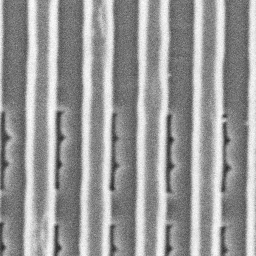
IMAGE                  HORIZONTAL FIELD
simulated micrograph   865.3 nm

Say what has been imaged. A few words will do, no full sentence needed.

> wiring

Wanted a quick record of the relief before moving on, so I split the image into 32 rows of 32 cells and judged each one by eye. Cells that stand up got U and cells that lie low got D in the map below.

DDDDUUUDDDDUUUDDDDUUUDDDDUUUDDDD
DDDDUUUDDDDUUUDDDDUUUDDDDUUUDDDD
DDDDUUUDDDDUUUDDDDUUUDDDDUUUDDDD
DDDDUUUDDDDUUUDDDDUUUDDDDUUUDDDD
DDDDUUUDDDDUUUDDDDUUUDDDDUUUDDDD
DDDDUUUDDDDUUUDDDDUUUDDDDUUUDDDD
DDDDUUUDDDDUUUDDDDUUUDDDDUUUDDDD
DDDDUUUDDDDUUUDDDDUUUDDDDUUUDDDD
DDDDUUUDDDDUUUDDDDUUUDDDDUUDDDDD
DDDDUUUDDDDUUUDDDDUUUDDDDUUDDDDD
DDDDUUUDDDDUUUDDDDUUUDDDDUUDDDDD
DDDDUUUDDDDUUUDDDDUUUDDDDUUDDDDU
DDDDUUUDDDDUUUDDDDUUUDDDDUUDDDDD
DDDDUUUDDDDUUUDDDDUUUDDDDUUDDDDU
DDDDUUDDDDDUUUDDDDUUDDDDDUUUDDDU
DDDDUUDDDDDUUDDDDDUUDDDDDUUDDDDU
DDDDUUDDDDDUUDDDDDUUDDDDUUUDDDDU
DDDDUUDDDDDUUDDDDDUUDDDDUUUDDDDU
DDDDUUDDDDDUUDDDDDUUDDDDUUUDDDDU
DDDDUUDDDDDUUDDDDDUUDDDDUUUDDDDU
DDDDUUDDDDDUUDDDDDUUDDDDUUUDDDDU
DDDDUUDDDDDUUDDDDDUUDDDDUUUDDDDU
DDDDUUDDDDDUUDDDDDUUDDDDUUUDDDDU
DDDDUUUDDDUUUDDDDDUUDDDDUUUDDDDU
DDDDUUUDDDUUUDDDDDUUDDDDUUUDDDDU
DDDDUUUDDDUUUDDDDUUUDDDDUUUDDDDU
DDDDUUDDDDUUUDDDDUUUDDDDUUUDDDDU
DDDDUUDDDDUUUDDDDUUUDDDDUUUDDDDU
DDDDUUDDDDUUUDDDDUUUDDDDUUUDDDDU
DDDUUUDDDDUUUDDDDUUUDDDDUUUDDDDU
DDDUUUDDDDUUUDDDDUUUDDDDUUUDDDDU
DDDDUUDDDDUUUDDDDUUUDDDDUUUDDDDU